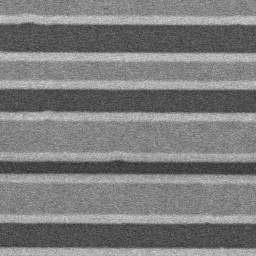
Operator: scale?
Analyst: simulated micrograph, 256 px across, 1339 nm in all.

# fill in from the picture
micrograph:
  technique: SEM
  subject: one or a few lines or trenches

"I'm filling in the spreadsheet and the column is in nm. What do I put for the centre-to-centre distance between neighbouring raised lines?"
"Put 334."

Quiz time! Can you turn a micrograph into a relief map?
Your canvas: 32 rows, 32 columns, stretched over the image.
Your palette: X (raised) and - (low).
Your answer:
XXXXXXXXXXXXXXXXXXXXXXXXXXXXXXXX
XXXXXXXXXXXXXXXXXXXXXXXXXXXXXXXX
-----XX---------XXXXXXXXXXXXXXXX
--------------------------------
--------------------------------
--------------------------------
--------------------------------
XXXXXXXXXXXXXXXXXXXXXXXXXXXXXXXX
XXXXXXXXXXXXXXXXXXXXXXXXXXXXXXXX
XXXXXXXXXXXXXXXXXXXXXXXXXXXXXXXX
XXXXXXXXXXXXXXXXXXXXXXXXXXXXXXXX
--------------------------------
--------------------------------
--------------------------------
-----XX-------------------------
XXXXXXXXXXXXXXXXXXXXXXXXXXXXXXXX
XXXXXXXXXXXXXXXXXXXXXXXXXXXXXXXX
XXXXXXXXXXXXXXXXXXXXXXXXXXXXXXXX
XXXXXXXXXXXXXXXXXXXXXXXXXXXXXXXX
XXXXXXXXXXXXXXXXXXXXXXXXXXXXXXXX
--------------------------------
--------------------------------
XXXXXXXXXXXXXXXXXXXXXXXXXXXXXXXX
XXXXXXXXXXXXXXXXXXXXXXXXXXXXXXXX
XXXXXXXXXXXXXXXXXXXXXXXXXXXXXXXX
XXXXXXXXXXXXXXXXXXXXXXXXXXXXXXXX
XXXXXXXXXXXXXXXXXXXXXXXXXXXXXXXX
--------------------------------
--------------------------------
--------------------------------
--------------------------------
---------------------------X----